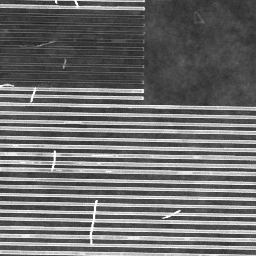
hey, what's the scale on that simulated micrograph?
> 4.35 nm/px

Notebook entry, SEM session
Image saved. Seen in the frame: parallel lines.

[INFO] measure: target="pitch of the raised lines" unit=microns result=0.0357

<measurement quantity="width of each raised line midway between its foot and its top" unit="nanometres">13.1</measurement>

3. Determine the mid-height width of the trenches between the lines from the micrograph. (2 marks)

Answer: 22.8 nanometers